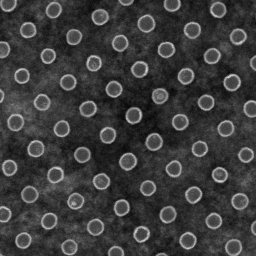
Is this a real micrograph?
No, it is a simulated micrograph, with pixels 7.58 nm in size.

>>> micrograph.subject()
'a regular array of raised bodies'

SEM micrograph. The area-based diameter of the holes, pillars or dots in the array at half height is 122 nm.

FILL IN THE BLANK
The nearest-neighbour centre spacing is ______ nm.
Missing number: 247